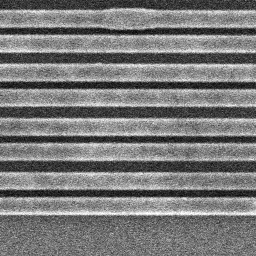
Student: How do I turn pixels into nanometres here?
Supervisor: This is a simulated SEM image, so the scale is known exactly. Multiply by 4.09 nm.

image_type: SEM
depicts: parallel lines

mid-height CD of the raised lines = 66.8 nm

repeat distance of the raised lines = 110 nm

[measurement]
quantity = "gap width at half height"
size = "0.0368 µm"